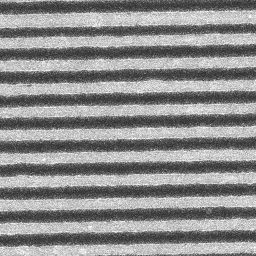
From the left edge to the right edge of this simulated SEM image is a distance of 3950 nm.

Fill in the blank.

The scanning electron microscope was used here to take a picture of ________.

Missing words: parallel lines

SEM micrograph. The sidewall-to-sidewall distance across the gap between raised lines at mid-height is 139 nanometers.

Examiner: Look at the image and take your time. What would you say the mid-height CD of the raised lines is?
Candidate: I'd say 14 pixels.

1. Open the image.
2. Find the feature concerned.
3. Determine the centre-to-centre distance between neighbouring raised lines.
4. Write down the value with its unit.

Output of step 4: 23.1 px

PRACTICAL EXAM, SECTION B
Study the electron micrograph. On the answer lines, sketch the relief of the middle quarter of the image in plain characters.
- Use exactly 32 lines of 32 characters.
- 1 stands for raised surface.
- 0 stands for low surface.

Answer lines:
00000000000000000000000000000000
00001100011111111111111111111111
11111111111111111111111111111111
11111111111111111111111111111111
11111111111111111111000000001100
00000000000000000000000000000000
00000000000000000000000000000000
11111111111111111111111111111111
11111111111111111111111111111111
11111111111111111111111111111111
11111111011111000000000000000000
00000000000000000000000000000000
00000000000000000000000000000001
11111111111111111111111111111111
11111111111111111111111111111111
11111111111111111111111111111111
10000000000000000000000000000000
00000000000000000000000000000000
00000000000000000000000001111111
11111111111111111111111111111111
11111111111111111111111111111111
11111111111111111111111111111111
00000000000000000000000000000000
00000000000000000000000000000000
00000000011001111111111111111111
11111111111111111111111111111111
11111111111111111111111111111111
11111111111111111111111111110110
00000000000000000000000000000000
00000000000000000000000000000000
11111111111111111111111111111111
11111111111111111111111111111111